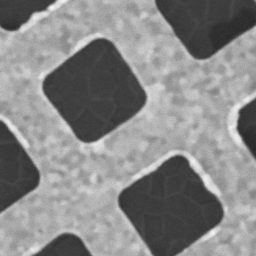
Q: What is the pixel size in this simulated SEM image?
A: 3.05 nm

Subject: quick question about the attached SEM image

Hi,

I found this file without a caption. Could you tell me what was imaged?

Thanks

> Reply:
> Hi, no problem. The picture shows holes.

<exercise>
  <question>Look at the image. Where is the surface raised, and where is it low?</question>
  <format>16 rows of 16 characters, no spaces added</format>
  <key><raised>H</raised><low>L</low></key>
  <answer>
LLLHHHHHHHLLLLLL
LLHHHHHHHHHLLLLL
HHHHHHLHHHHLLLLH
HHHHLLLLHHHHLHHH
HHHLLLLLHHHHHHHH
HHHLLLLLLHHHHHHH
HHHLLLLLLHHHHHHL
HHHHLLLLHHHHHHHL
LHHHHLLHHHHHHHHL
LLHHHHHHHHHHHHHH
LLHHHHHHHHLLHHHH
LLHHHHHHLLLLLHHH
LHHHHHHLLLLLLLHH
HHHHHHHHLLLLLLHH
HHHHHHHHLLLLLHHH
HHHLLHHHHLLLHHHH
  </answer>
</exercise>